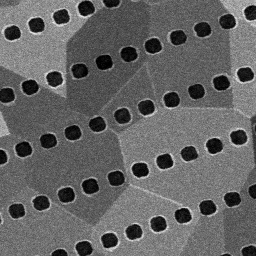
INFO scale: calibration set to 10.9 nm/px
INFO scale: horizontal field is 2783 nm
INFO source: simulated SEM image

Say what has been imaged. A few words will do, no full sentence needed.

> a regular array of holes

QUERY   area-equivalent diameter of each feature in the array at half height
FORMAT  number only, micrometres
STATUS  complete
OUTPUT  0.181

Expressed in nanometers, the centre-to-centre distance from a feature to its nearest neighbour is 280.